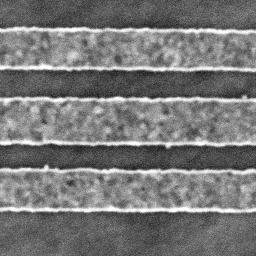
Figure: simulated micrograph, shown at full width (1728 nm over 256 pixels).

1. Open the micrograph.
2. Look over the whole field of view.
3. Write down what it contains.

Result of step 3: lines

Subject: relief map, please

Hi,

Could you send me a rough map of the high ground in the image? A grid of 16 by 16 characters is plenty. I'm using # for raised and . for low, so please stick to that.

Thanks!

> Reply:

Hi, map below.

................
................
################
################
................
................
################
################
################
................
................
################
################
................
................
................